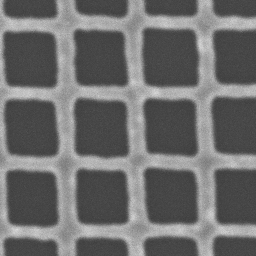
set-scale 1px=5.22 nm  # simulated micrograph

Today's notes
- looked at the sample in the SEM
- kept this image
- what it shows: a regular array of holes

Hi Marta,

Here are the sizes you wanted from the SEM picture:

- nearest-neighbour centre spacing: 0.36 microns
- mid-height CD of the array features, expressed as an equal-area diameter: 62 px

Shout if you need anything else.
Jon